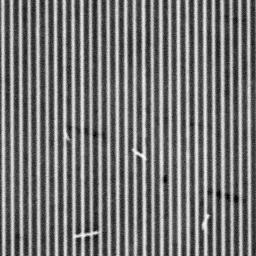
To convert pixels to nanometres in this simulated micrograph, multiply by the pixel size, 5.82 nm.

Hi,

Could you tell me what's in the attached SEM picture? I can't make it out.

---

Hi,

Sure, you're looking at parallel lines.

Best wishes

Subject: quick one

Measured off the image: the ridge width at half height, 10.9 nm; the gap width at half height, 0.0379 micrometres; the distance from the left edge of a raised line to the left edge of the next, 0.0512 microns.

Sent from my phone